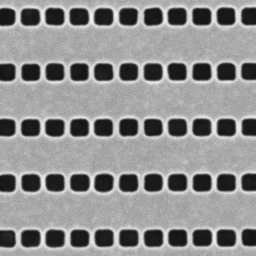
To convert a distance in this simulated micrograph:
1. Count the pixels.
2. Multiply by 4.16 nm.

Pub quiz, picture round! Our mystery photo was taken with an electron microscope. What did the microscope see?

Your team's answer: a regular array of holes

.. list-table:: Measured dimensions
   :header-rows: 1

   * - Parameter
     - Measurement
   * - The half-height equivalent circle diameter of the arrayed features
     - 82.7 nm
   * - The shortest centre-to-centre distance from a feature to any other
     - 101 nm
